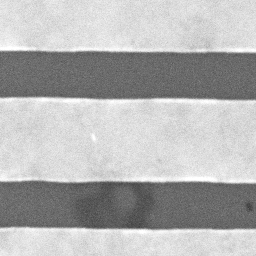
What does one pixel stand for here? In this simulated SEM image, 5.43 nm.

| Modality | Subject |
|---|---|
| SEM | wiring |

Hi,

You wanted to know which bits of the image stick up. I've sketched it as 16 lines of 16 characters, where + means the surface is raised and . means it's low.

++++++++++++++++
.+++++++++++++++
..++++++++++.+++
................
................
................
++++++++++++++++
++++++++++++++++
++++..++++++++++
++++++++++++++++
++++++++++++++++
................
................
................
++++++++++++++++
++++++++++++++++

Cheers